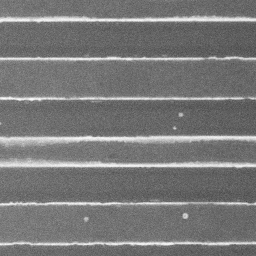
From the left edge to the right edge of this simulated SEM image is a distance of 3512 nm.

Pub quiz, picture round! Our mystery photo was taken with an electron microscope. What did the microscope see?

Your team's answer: lines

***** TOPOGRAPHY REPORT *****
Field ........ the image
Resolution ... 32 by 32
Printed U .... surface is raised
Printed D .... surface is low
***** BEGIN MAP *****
UUUUUUUUUUUUUUUUUUUUUUUUUUUUUUUU
UUUUUUUUUUUUUUUUUUUUUUUUUUUUUUUU
DDDDDDDDDDDUUUUUDDDDDDDDDDDDDDDD
DDDDDDDDDDDDDDDDDDDDDDDDDDDDDDDD
DDDDDDDDDDDDDDDDDDDDDDDDDDDDDDDD
DDDDDDDDDDDDDDDDDDDDDDDDDDDDDDDD
DDDDDDDDDDDDDDDDDDDDDDDDDDDDDDDD
UUUUUUUUUUUUUUUUUUUUUUUUUUUUUUUU
UUUUUUUUUUUUUUUUUUUUUUUUUUUUUUUU
UUUUUUUUUUUUUUUUUUUUUUUUUUUUUUUU
UUUUUUUUUUUUUUUUUUUUUUUUUUUUUUUU
UUUUUUUUUUUUUUUUUUUUUUUUUUUUUUUU
DDDDDDDDDDDDDDDDDDDDDDDDDDDDDDDD
DDDDDDDDDDDDDDDDDDDDDDDDDDDDDDDD
DDDDDDDDDDDDDDDDDDDDDDDDDDDDDDDD
DDDDDDDDDDDDDDDDDDDDDDDDDDDDDDDD
DDDDDDDDDDDDDDDDDDDDDDDDDDDDDDDD
UUUUUUUUUUUUUUUUUUUUUUUUUUUUUUUU
UUUUUUUUUUUUUUUUUUUUUUUUUUUUUUUU
UUUUUUUUUUUUUUUUUUUUUUUUUUUUUUUU
UUUUUUUUUUUUUUUUUUUUUUUUUUUUUUUU
DDDDDDDDDDDDDDDDDDDDDDDDDDDDDDDD
DDDDDDDDDDDDDDDDDDDDDDDDDDDDDDDD
DDDDDDDDDDDDDDDDDDDDDDDDDDDDDDDD
DDDDDDDDDDDDDDDDDDDDDDDDDDDDDDDD
DDDDDDUUDDUUDDDDDUUUUUUUUUUUUUUD
UUUUUUUUUUUUUUUUUUUUUUUUUUUUUUUU
UUUUUUUUUUUUUUUUUUUUUUUUUUUUUUUU
UUUUUUUUUUUUUUUUUUUUUUUUUUUUUUUU
UUUUUUUUUUUUUUUUUUUUUUUUUUUUUUUU
UUDDDUUUUDUDDDUDDDDDDDDDDDDDDDDD
DDDDDDDDDDDDDDDDDDDDDDDDDDDDDDDD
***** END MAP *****